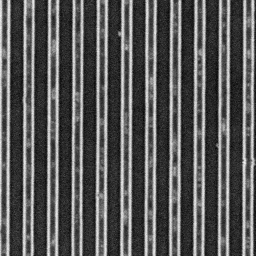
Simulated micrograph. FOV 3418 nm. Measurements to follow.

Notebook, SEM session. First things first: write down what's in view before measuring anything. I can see parallel lines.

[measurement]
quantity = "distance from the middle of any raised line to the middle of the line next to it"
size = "326 nm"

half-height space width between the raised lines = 217 nanometers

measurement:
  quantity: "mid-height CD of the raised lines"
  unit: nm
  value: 114